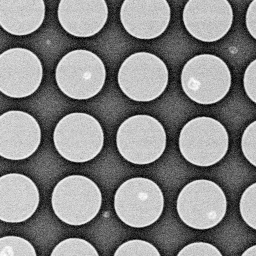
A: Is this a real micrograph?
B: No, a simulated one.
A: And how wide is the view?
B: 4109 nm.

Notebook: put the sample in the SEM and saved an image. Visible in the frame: an array of small figures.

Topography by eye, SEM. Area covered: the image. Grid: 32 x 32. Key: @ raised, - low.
@@@@@---@@@@@--@@@@@@--@@@@@@--@
@@@@@--@@@@@@--@@@@@@--@@@@@@--@
@@@@@--@@@@@@--@@@@@@--@@@@@@--@
@@@@@---@@@@@---@@@@@--@@@@@@--@
----------@------@@@----@@@@----
--------------------------------
-@@@-----@@---------------------
@@@@@---@@@@----@@@@----@@@@----
@@@@@--@@@@@@--@@@@@@--@@@@@---@
@@@@@--@@@@@@--@@@@@@--@@@@@@--@
@@@@@--@@@@@@--@@@@@@--@@@@@@--@
@@@@----@@@@----@@@@---@@@@@---@
-----------------@@-----@@@-----
--------------------------------
@@@@----@@@------@@-------------
@@@@@--@@@@@---@@@@@---@@@@----@
@@@@@--@@@@@@--@@@@@@--@@@@@---@
@@@@@--@@@@@@--@@@@@@-@@@@@@--@@
@@@@@--@@@@@@--@@@@@---@@@@@--@@
@@@@----@@@@---@@@@@---@@@@@---@
------------------------@@@-----
--------------------------------
@@@@----@@@-----@@@-------------
@@@@@--@@@@@---@@@@@---@@@@----@
@@@@@--@@@@@@-@@@@@@--@@@@@@--@@
@@@@@--@@@@@@-@@@@@@--@@@@@@--@@
@@@@---@@@@@---@@@@@--@@@@@@--@@
@@@-----@@@----@@@@----@@@@@---@
-------------------------@------
--------------------------------
@@@@---@@@@----@@@@-----@@------
@@@@---@@@@@---@@@@@---@@@@----@